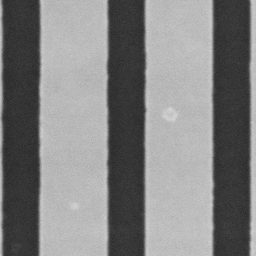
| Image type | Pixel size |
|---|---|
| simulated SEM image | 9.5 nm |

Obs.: lines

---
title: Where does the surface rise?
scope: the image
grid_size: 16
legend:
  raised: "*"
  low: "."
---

...****..****...
...****..****...
...****..****...
...****..****...
...****..****...
..*****..****...
..*****..****...
..*****..****...
..*****..****...
..*****..****...
...****..****...
...****..****...
..*****..****...
..*****..****...
..*****..****...
..*****..****...